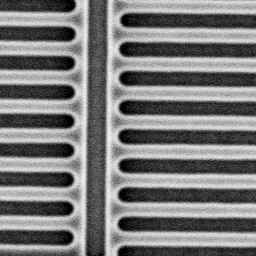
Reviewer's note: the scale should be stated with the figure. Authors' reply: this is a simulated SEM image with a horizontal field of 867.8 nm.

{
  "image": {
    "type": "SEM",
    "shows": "groups of lines, slits or small figures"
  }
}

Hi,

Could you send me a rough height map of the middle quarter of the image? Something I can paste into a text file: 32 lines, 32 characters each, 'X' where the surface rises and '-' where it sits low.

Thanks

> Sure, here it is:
---XX------XXXXXXXXXXXXXXXXXXXXX
--XXX------XXXXX-----XXXXXXXXXXX
XXXXX------XXX------------------
XXXXX------XX-------------------
XXXXX------XXX------------------
--XXX------XXX------------------
---XX------XXXXXXXXXXXXXXXXXXXXX
---XX------XXXXXXXXXXXXXXXXXXXXX
--XXX------XXXXXXXXXXXXXXXXXXXXX
XXXXX------XXX------------------
XXXXX------XX-------------------
XXXXX------XXX------------------
-XXXX------XXX------------------
---XX------XXXXXXXXXXXXXXXXXXXXX
---XX------XXXXXXXXXXXXXXXXXXXXX
---XX------XXXXXXXXXXXXXXXXXXXXX
-XXXX------XXX------------------
XXXXX------XX-------------------
XXXXX------XX-------------------
-XXXX------XXX------------------
---XX------XXXXXX---XX-----XXX--
---XX------XXXXXXXXXXXXXXXXXXXXX
---XX------XXXXXXXXXXXXXXXXXXXXX
--XXX------XXXX-----------------
XXXXX------XXX------------------
XXXXX------XX-------------------
XXXXX------XXX------------------
--XXX------XXXX-----------------
---XX------XXXXXXXXXXXXXXXXXXXXX
---XX------XXXXXXXXXXXXXXXXXXXXX
--XXX------XXXX-----------XXXXXX
XXXXX------XXX------------------